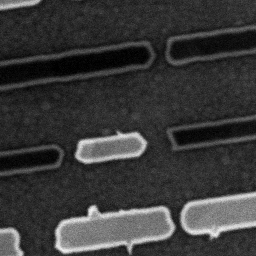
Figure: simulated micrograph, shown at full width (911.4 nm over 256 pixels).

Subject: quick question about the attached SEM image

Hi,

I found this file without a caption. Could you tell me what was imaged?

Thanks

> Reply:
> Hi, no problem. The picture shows one or a few lines or trenches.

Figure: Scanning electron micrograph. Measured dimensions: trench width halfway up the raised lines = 228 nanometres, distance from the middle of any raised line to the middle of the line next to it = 304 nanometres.